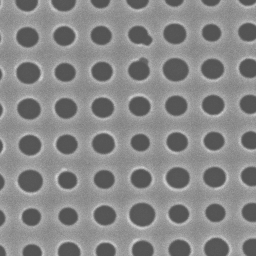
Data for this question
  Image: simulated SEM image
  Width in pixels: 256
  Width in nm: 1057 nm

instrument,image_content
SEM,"a regular array of holes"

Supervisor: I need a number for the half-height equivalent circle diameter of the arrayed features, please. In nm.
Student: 87.3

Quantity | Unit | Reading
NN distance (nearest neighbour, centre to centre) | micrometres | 0.148